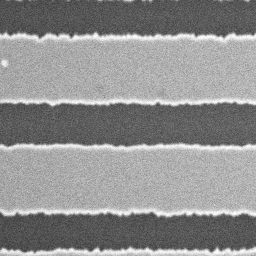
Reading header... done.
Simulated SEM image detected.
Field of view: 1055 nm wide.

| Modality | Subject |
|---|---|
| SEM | lines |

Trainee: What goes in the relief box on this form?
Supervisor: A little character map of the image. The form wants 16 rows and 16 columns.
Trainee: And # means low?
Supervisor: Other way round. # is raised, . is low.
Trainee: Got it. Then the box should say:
................
................
################
################
################
################
..........#.....
................
................
################
################
################
################
................
................
................